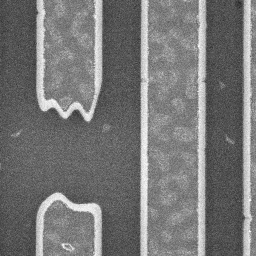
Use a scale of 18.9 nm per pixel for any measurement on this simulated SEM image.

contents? one or a few lines or trenches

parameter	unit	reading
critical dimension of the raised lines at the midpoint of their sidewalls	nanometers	1130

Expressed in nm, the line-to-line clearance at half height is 824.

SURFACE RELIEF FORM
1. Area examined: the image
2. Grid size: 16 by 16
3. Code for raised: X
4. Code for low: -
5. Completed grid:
--XXXX---XXXX--X
---XXX---XXXX--X
---XXX---XXXX--X
---XXX---XXXX--X
--XXXX---XXXX--X
--XXXX---XXXX--X
---XXX---XXXX--X
---------XXXX--X
---------XXXX--X
---------XXXX--X
---------XXXX--X
---------XXXX--X
---X-----XXXX--X
--XXXX---XXXX--X
--XXXX---XXXX--X
--XXXX---XXXX--X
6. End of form